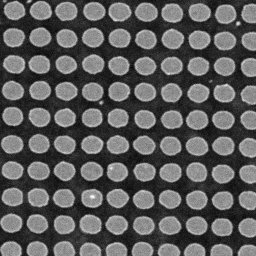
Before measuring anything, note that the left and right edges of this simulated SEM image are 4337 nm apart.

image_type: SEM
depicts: a regular array of raised bodies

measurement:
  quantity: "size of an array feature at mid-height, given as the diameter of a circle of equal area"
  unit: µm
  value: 0.33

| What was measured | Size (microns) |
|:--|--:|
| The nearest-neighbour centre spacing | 0.44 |